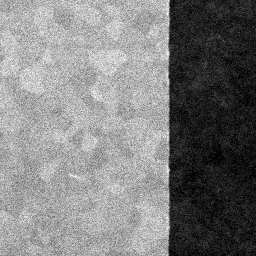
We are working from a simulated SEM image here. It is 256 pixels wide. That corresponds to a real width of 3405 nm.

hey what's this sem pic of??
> one or a few lines or trenches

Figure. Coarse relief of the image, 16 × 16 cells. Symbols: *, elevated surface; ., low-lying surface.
***********.....
***********.....
***********.....
***********.....
***********.....
***********.....
***********.....
***********.....
***********.....
***********.....
***********.....
***********.....
***********.....
***********.....
***********.....
**********......